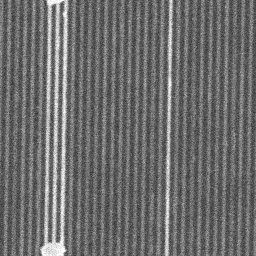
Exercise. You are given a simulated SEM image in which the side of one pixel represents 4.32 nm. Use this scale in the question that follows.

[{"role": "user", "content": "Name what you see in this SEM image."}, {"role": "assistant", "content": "parallel lines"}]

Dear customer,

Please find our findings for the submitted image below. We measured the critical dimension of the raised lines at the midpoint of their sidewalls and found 0.0124 micrometres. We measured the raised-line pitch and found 34.8 nanometres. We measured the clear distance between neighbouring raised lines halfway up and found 21.6 nanometers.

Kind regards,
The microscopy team